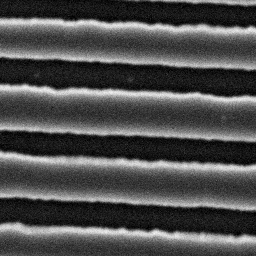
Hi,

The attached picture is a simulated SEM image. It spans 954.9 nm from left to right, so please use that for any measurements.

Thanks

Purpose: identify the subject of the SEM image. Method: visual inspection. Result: lines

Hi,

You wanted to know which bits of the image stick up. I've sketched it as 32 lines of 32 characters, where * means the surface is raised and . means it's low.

..............................**
................................
.*..*...........................
**************************......
********************************
********************************
********************************
........************************
..............................**
................................
................................
***************.................
********************************
********************************
********************************
********************************
......**************************
............................****
................................
***.............................
**********************..........
********************************
********************************
********************************
********************************
...................*************
................................
................................
***.............................
************************.*......
********************************
********************************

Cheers